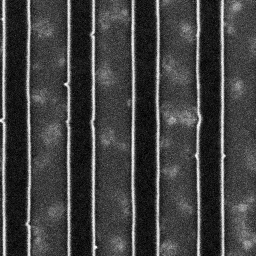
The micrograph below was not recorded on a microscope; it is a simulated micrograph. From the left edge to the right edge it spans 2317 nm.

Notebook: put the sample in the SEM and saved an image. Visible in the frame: one or a few lines or trenches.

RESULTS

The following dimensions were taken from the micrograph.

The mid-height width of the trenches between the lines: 356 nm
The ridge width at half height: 227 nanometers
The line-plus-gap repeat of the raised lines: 584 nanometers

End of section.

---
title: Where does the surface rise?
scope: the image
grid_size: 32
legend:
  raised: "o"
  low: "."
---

.ooo.....ooo.....ooo.....ooo....
.ooo.....ooo.....ooo.....ooo....
oooo.....ooo.....ooo.....ooo....
.ooo.....ooo.....ooo.....ooo....
.ooo.....ooo.....ooo.....ooo....
.ooo.....ooo.....ooo.....ooo....
.ooo.....ooo.....ooo.....ooo....
.ooo.....ooo.....ooo.....ooo....
oooo.....ooo.....ooo.....ooo....
ooo......ooo.....ooo.....ooo....
ooo.....oooo.....ooo.....ooo....
ooo......ooo.....ooo.....ooo....
oooo.....ooo.....ooo.....ooo....
oooo.....ooo.....ooo.....ooo....
oooo.....ooo.....ooo.....ooo....
oooo....oooo.....ooo.....ooo....
.ooo.....ooo.....ooo.....ooo....
.ooo.....ooo.....ooo.....ooo....
oooo.....ooo.....ooo.....ooo....
oooo.....ooo.....ooo.....ooo....
oooo.....ooo.....ooo.....ooo....
oooo.....ooo.....ooo.....ooo....
oooo.....ooo.....ooo.....ooo....
oooo.....ooo.....ooo.....ooo....
oooo.....ooo.....ooo.....ooo....
oooo.....ooo.....ooo.....ooo....
oooo.....ooo.....ooo.....ooo....
.ooo.....ooo.....ooo.....ooo....
.ooo.....ooo.....ooo.....ooo....
.ooo.....ooo.....ooo.....ooo....
.ooo.....ooo.....ooo.....ooo....
.ooo.....ooo.....ooo.....ooo....